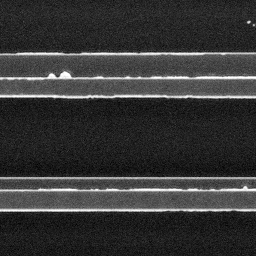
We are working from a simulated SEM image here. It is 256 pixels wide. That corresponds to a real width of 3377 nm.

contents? lines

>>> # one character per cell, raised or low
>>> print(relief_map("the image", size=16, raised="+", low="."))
................
................
................
++++++++++++++++
++++++++++++++++
++++++++++++++++
................
................
................
................
................
++++++++++++++++
++++++++++++++++
................
................
................